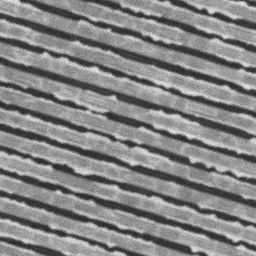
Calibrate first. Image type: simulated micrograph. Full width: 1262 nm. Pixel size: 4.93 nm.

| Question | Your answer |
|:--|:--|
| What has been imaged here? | parallel lines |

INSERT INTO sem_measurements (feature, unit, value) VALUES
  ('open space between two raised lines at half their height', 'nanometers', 31.3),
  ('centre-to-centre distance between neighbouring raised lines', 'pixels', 21.2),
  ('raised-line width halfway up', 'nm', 75.4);